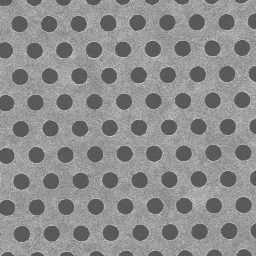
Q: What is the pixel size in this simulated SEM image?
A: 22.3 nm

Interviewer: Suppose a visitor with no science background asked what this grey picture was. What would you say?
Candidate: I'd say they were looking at a regular array of holes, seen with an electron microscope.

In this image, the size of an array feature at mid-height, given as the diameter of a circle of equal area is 365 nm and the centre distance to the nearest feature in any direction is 658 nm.